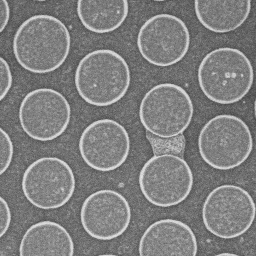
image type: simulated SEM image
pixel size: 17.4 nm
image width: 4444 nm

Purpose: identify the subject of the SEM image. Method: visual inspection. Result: a regular array of raised bodies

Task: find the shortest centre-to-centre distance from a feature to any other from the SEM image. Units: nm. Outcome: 1170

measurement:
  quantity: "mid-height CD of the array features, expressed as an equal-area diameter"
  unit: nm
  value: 876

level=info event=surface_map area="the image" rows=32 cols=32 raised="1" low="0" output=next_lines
10000000001111110000000001111110
10000000001111110000000001111110
10001110001111100001110001111100
00011111000111000011111000111000
00111111000000000111111000000000
00111111100000000111111000000000
00111111000011000011111000011100
00111111001111100001110000111110
10011110001111110000000001111110
10000000001111110000000001111110
10000000001111110000000001111110
10001110001111100001111000111110
00011111000111000011111100011100
00011111100000000011111100000000
00011111100000000011111100000000
00011111000011100011111000111100
00011111000111110011111001111110
10000000001111110001111001111110
10000000001111110001111001111110
10000000001111110001111001111110
10001111000111100011111000111100
00011111100000000011111100000000
00011111100000000011111100000000
00011111100000000011111100011100
00011111100111100011111000111110
10001111000111110000110000111111
10000000001111110000000001111111
10000000001111110000000000111111
10001111000111110001111000111110
00011111100011000011111100011000
00011111100000000011111100000000
00011111100000000011111100000000